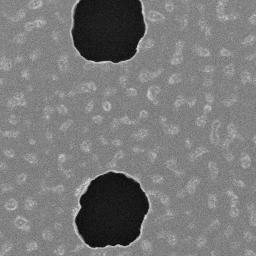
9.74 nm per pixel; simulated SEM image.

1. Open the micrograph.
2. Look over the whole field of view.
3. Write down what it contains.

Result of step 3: holes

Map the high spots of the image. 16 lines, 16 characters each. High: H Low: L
HHHHHLLLLHHHHHHH
HHHHHLLLLHHHHHHH
HHHHHLLLLHHHHHHH
HHHHHLLLHHHHHHHH
HHHHHHHHHHHHHHHH
HHHHHHHHHHHHHHHH
HHHHHHHHHHHHHHHH
HHHHHHHHHHHHHHHH
HHHHHHHHHHHHHHHH
HHHHHHHHHHHHHHHH
HHHHHHHHHHHHHHHH
HHHHHHLLLHHHHHHH
HHHHHLLLLHHHHHHH
HHHHHLLLLHHHHHHH
HHHHHLLLLHHHHHHH
HHHHHHHHHHHHHHHH